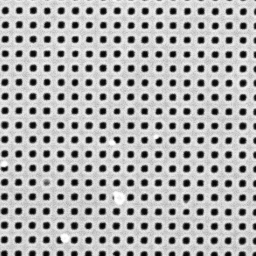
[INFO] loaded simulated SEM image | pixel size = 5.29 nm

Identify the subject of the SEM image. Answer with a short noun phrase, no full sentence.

a regular array of holes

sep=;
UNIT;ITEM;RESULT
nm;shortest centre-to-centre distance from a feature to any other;72.8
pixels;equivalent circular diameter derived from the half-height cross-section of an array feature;7.32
